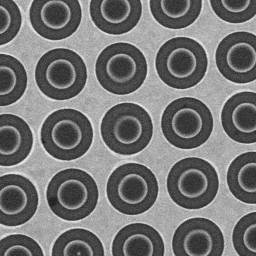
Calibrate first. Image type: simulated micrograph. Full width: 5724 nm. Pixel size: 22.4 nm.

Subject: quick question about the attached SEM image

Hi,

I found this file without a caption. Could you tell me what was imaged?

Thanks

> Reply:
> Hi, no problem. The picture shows an array of small figures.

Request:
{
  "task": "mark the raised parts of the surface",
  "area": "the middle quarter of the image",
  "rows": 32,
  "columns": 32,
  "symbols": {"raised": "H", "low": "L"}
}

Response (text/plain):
HHLLLLHHLLLHHHHHHHLLLHHLLLHHHHHH
HHHLLLHHLLLHHHHHHHLLLHHLLLHHHHHH
HHHLLLHHLLLHHHHHHLLLLHHLLLLHHHHH
HHHLLLHHLLLLHHHHHLLLLHHHLLLLLLLL
HHLLLLHHHLLLLLLLLLLLHHHHHLLLLLLL
HLLLLHHHHLLLLLLLLLLHHHHHHHLLLLLL
LLLLHHHHHHLLLLLLLLHHHHHHHHHHHHHH
LLLLHHHHHHHHLLLLHHHHHHHHHHHHHHHH
LLHHHHHHHHHHHHHHHHHHHHHHHHHHHLLL
HHHHHHHHHHHHHHHHHHHHHHHHHHHLLLLL
HHHHHHHHHHHHLLLLLLLHHHHHHHLLLLLL
LLLHHHHHHHHLLLLLLLLLLHHHHLLLLHHH
LLLLLHHHHHLLLLLLLLLLLHHHLLLLHHHH
LLLLLLHHHHLLLLHHHHLLLLHHLLLHHHHH
HHLLLLLHHLLLLHHHHHHLLLHHLLLHHHHH
HHHLLLLHHLLLLHHHHHHLLLHHLLLHHHHH
HHHHLLLHHLLLLHHHHHHLLLHHLLLLHHHH
HHHHLLLLHLLLLHHHHHHLLLHHHLLLHHHH
HHHHLLLHHLLLLHHHHHHLLLHHHLLLLLLL
HHHHLLLHHHLLLLHHHLLLLHHHHHLLLLLL
HHHLLLLHHHHLLLLLLLLLLHHHHHHLLLLL
LLLLLLHHHHHHLLLLLLLLHHHHHHHHHHLH
LLLLLHHHHHHHHLLLLLHHHHHHHHHHHHHH
LLLLHHHHHHHHHHHHHHHHHHHHHHHHHHLL
HHHHHHHHHHHHHHHLLHHHHHHHHHHHLLLL
HHHHHHHHHHHHHLLLLLLLHHHHHHHLLLLL
LLLLLHHHHHHHLLLLLLLLLLHHHHHLLLLH
LLLLLLHHHHHHLLLLLLLLLLLHHHLLLLHH
LLLLLLLHHHHLLLLHHHHLLLLHHHLLLHHH
HHHHLLLLHHHLLLHHHHHHLLLHHHLLLHHH
HHHHHLLLHHHLLLHHHHHHHLLLHHLLLHHH
HHHHHLLLLHLLLLHHHHHHHLLLHHLLLHHH